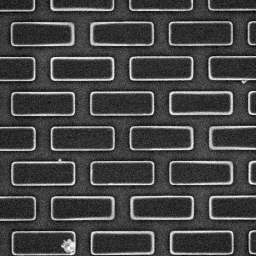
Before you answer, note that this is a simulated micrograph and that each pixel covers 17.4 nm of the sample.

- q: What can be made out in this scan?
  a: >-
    groups of lines, slits or small figures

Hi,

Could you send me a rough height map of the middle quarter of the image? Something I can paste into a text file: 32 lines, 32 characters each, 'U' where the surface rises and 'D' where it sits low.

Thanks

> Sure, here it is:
UUUUUUUUUUUUDDDDDUUUUUUUUUUUUUUU
UUUUUUUUUUUUDDDDDUUUUUUUUUUUUUUU
UUUUUUUUUUUUDDDDDUUUUUUUUUUUUUUU
UUUUUUUUUUUUDDDDDUUUUUUUUUUUUUUU
DDDDDDDDDDDDDDDDDDDDDDDDDDDDDDDD
DDDDDDDDDDDDDDDDDDDDDDDDDDDDDDDD
DDDDDDDDDDDDDDDDDDDDDDDDDDDDDDDD
UUDDDDDUUUUUUUUUUUUUUUDDDDDUUUUU
UUDDDDDUUUUUUUUUUUUUUUDDDDDUUUUU
UUDDDDDUUUUUUUUUUUUUUUDDDDDUUUUU
UUDDDDDUUUUUUUUUUUUUUUDDDDDUUUUU
UUDDDDDUUUUUUUUUUUUUUUDDDDDUUUUU
UUDDDDDUUUUUUUUUUUUUUUDDDDDDDDDD
DDDDDDDDDDDDDDDDDDDDDDDDDDDDDDDD
DDDDDDDDDDDDDDDDDDDDDDDDDDDDDDDD
DDDDDDDDDDDDDDDDDDDDDDDDDDDDDDDD
UUUUUUUUUUUUDDDDDUUUUUUUUUUUUUUU
UUUUUUUUUUUUDDDDDUUUUUUUUUUUUUUU
UUUUUUUUUUUUDDDDDUUUUUUUUUUUUUUU
UUUUUUUUUUUUDDDDDUUUUUUUUUUUUUUU
UUUUUUUUUUUUDDDDDUUUUUUUUUUUUUUU
DDDDDDDDDDDDDDDDDDDDDDDDDDDDDDDD
DDDDDDDDDDDDDDDDDDDDDDDDDDDDDDDD
DDDDDDDDDDDDDDDDDDDDDDDDDDDDDDDD
DDDDDDDDUUUUUUUUUUUUUUDDDDDUUUUU
UUUDDDDUUUUUUUUUUUUUUUDDDDDUUUUU
UUUDDDDUUUUUUUUUUUUUUUDDDDDUUUUU
UUUDDDDUUUUUUUUUUUUUUUDDDDDUUUUU
UUUDDDDUUUUUUUUUUUUUUUDDDDDUUUUU
UUDDDDDUUUUUUUUUUUUUUUDDDDDUUUUU
DDDDDDDDDDDDDDDDDDDDDDDDDDDDDDDD
DDDDDDDDDDDDDDDDDDDDDDDDDDDDDDDD